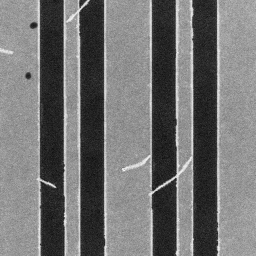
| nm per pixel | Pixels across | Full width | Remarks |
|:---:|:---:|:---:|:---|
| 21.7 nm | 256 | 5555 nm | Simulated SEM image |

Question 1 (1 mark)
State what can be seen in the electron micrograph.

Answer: lines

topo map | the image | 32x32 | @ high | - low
@@@@@---@@---@@@@@@---@@---@@@@@
@@@@@---@@---@@@@@@---@@---@@@@@
@@@@@---@@---@@@@@@---@@---@@@@@
@@@@@---@@---@@@@@@---@@---@@@@@
@@@@@---@@---@@@@@@---@@---@@@@@
@@@@@---@@---@@@@@@---@@---@@@@@
@@@@@---@@---@@@@@@---@@---@@@@@
@@@@@---@@---@@@@@@---@@---@@@@@
@@@@@---@@---@@@@@@---@@---@@@@@
@@@@@---@@---@@@@@@---@@---@@@@@
@@@@@---@@---@@@@@@---@@---@@@@@
@@@@@---@@---@@@@@@---@@---@@@@@
@@@@@---@@---@@@@@@---@@---@@@@@
@@@@@---@@---@@@@@@---@@---@@@@@
@@@@@---@@---@@@@@@---@@---@@@@@
@@@@@---@@---@@@@@@---@@---@@@@@
@@@@@---@@---@@@@@@---@@---@@@@@
@@@@@---@@---@@@@@@---@@---@@@@@
@@@@@---@@---@@@@@@---@@---@@@@@
@@@@@---@@---@@@@@@---@@---@@@@@
@@@@@---@@---@@@@@@---@@---@@@@@
@@@@@---@@---@@@@@@---@@---@@@@@
@@@@@---@@---@@@@@@---@@---@@@@@
@@@@@---@@---@@@@@@---@@---@@@@@
@@@@@---@@---@@@@@@---@@---@@@@@
@@@@@---@@---@@@@@@---@@---@@@@@
@@@@@---@@---@@@@@@---@@---@@@@@
@@@@@---@@---@@@@@@---@@---@@@@@
@@@@@---@@---@@@@@@---@@---@@@@@
@@@@@---@@---@@@@@@---@@---@@@@@
@@@@@---@@---@@@@@@---@@---@@@@@
@@@@@---@@---@@@@@@---@@---@@@@@